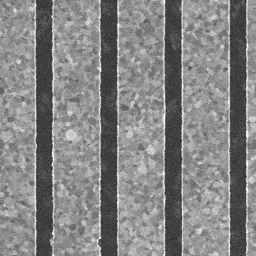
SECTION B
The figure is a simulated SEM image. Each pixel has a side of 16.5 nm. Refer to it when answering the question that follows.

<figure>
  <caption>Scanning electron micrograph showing one or a few lines or trenches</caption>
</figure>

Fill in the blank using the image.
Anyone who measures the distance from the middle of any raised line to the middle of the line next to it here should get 1060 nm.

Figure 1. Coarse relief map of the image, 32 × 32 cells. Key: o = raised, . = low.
oooo...ooooo...oooooo..oooooo..o
oooo...oooooo..oooooo..oooooo..o
oooo...oooooo..oooooo..oooooo..o
oooo...ooooo...oooooo..oooooo..o
oooo...oooooo..oooooo..oooooo..o
oooo...oooooo..oooooo..oooooo..o
oooo...oooooo..oooooo..oooooo..o
oooo...oooooo..oooooo..oooooo..o
oooo...oooooo..oooooo..oooooo..o
oooo...ooooo...oooooo..oooooo..o
oooo...oooooo..oooooo..oooooo..o
oooo...ooooo...oooooo..oooooo..o
oooo...oooooo..oooooo..oooooo..o
oooo...oooooo..oooooo..oooooo..o
oooo...oooooo..oooooo..oooooo..o
oooo...oooooo..oooooo..oooooo..o
oooo...oooooo..oooooo..oooooo..o
oooo...ooooo...oooooo..oooooo..o
oooo...oooooo..oooooo..oooooo..o
oooo...oooooo..oooooo..oooooo..o
oooo...oooooo..oooooo..oooooo..o
oooo...oooooo..oooooo..oooooo..o
oooo...oooooo..ooooo...oooooo..o
oooo...ooooo...oooooo..oooooo..o
oooo...ooooo...oooooo..oooooo..o
oooo...oooooo..oooooo..oooooo..o
oooo...ooooo...oooooo..oooooo..o
oooo...ooooo...oooooo..oooooo..o
oooo...oooooo..oooooo..oooooo..o
oooo...ooooo...oooooo..oooooo..o
oooo..oooooo...oooooo..oooooo..o
oooo...oooooo..oooooo..oooooo..o